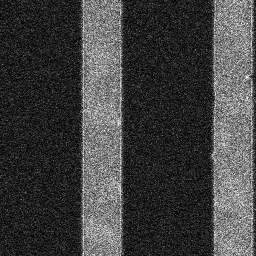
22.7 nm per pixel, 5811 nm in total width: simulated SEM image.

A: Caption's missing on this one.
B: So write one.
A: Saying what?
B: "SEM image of one or a few lines or trenches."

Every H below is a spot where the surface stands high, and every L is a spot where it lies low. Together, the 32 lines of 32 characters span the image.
HHHHHHHHHHLLLLLHHHHHHHHHHHHLLLLL
HHHHHHHHHHLLLLLHHHHHHHHHHHHLLLLH
HHHHHHHHHHLLLLLHHHHHHHHHHHHLLLLH
HHHHHHHHHHLLLLLHHHHHHHHHHHHLLLLH
HHHHHHHHHHLLLLLHHHHHHHHHHHHLLLLH
HHHHHHHHHHLLLLLHHHHHHHHHHHHLLLLH
HHHHHHHHHHLLLLLHHHHHHHHHHHHLLLLH
HHHHHHHHHHLLLLLHHHHHHHHHHHHLLLLH
HHHHHHHHHHLLLLLHHHHHHHHHHHHLLLLH
HHHHHHHHHHLLLLLHHHHHHHHHHHHLLLLH
HHHHHHHHHHLLLLLHHHHHHHHHHHHLLLLH
HHHHHHHHHHHLLLLHHHHHHHHHHHHLLLLH
HHHHHHHHHHLLLLLHHHHHHHHHHHHLLLLH
HHHHHHHHHHLLLLLHHHHHHHHHHHHLLLLL
HHHHHHHHHHLLLLLHHHHHHHHHHHHLLLLH
HHHHHHHHHHLLLLLHHHHHHHHHHHHLLLLH
HHHHHHHHHHLLLLLHHHHHHHHHHHHLLLLH
HHHHHHHHHHLLLLLHHHHHHHHHHHHLLLLH
HHHHHHHHHHLLLLLHHHHHHHHHHHHLLLLH
HHHHHHHHHHLLLLLHHHHHHHHHHHHLLLLH
HHHHHHHHHHLLLLLHHHHHHHHHHHHLLLLH
HHHHHHHHHHLLLLLHHHHHHHHHHHHLLLLH
HHHHHHHHHHLLLLLHHHHHHHHHHHHLLLLH
HHHHHHHHHHLLLLLHHHHHHHHHHHHLLLLL
HHHHHHHHHHLLLLLHHHHHHHHHHHHLLLLL
HHHHHHHHHHLLLLLHHHHHHHHHHHHLLLLL
HHHHHHHHHHLLLLLHHHHHHHHHHHHLLLLL
HHHHHHHHHHLLLLLHHHHHHHHHHHHLLLLL
HHHHHHHHHHLLLLLHHHHHHHHHHHHLLLLH
HHHHHHHHHHLLLLLHHHHHHHHHHHHLLLLH
HHHHHHHHHHLLLLLHHHHHHHHHHHHLLLLH
HHHHHHHHHHLLLLLHHHHHHHHHHHHLLLLL